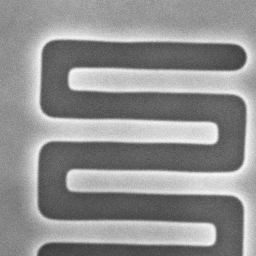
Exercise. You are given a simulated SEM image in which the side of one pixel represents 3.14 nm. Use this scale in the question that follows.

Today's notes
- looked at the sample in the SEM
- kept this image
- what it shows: groups of lines, slits or small figures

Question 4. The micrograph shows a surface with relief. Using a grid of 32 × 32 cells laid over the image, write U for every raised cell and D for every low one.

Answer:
UUUUUUUUUUUUUUUUUUUUUUUUUUUUUUUU
UUUUUUUUUUUUUUUUUUUUUUUUUUUUUUUU
UUUUUUUUUUUUUUUUUUUUUUUUUUUUUUUU
UUUUUUUUUUUUUUUUUUUUUUUUUUUUUUUU
UUUUUUUUUUUUUUUUUUUUUUUUUUUUUUUU
UUUUUUDDDDDDDDDDDDDDDDDDDDDDDDUU
UUUUUDDDDDDDDDDDDDDDDDDDDDDDDDDU
UUUUUDDDDDDDDDDDDDDDDDDDDDDDDDDU
UUUUUDDDDDDDDDDDDDDDDDDDDDDDDDUU
UUUUUDDDDUUUUUUUUUUUUUUUUUUUUUUU
UUUUUDDDDUUUUUUUUUUUUUUUUUUUUUUU
UUUUUDDDDDDDDDDDDDDDDDDDUUUUUUUU
UUUUUDDDDDDDDDDDDDDDDDDDDDDDDDUU
UUUUUDDDDDDDDDDDDDDDDDDDDDDDDDDU
UUUUUUDDDDDDDDDDDDDDDDDDDDDDDDDU
UUUUUUUUUUUUUUUUUUUUUUUUUUUDDDDU
UUUUUUUUUUUUUUUUUUUUUUUUUUUDDDDU
UUUUUUUUUUUUUUUUUUUUUUUUUUUDDDDU
UUUUUDDDDDDDDDDDDDDDDDDDDDDDDDDU
UUUUUDDDDDDDDDDDDDDDDDDDDDDDDDDU
UUUUUDDDDDDDDDDDDDDDDDDDDDDDDDUU
UUUUUDDDDUUUUUUUUUUUUUDDDDDDDUUU
UUUUUDDDUUUUUUUUUUUUUUUUUUUUUUUU
UUUUUDDDDUUUUUUUUUUUUUUUUUUUUUUU
UUUUUDDDDDDDDDDDDDDDDDDDDDDDDUUU
UUUUUDDDDDDDDDDDDDDDDDDDDDDDDDUU
UUUUUDDDDDDDDDDDDDDDDDDDDDDDDDDU
UUUUUUUDDDDDDDDDDDDDDDDDDDDDDDDU
UUUUUUUUUUUUUUUUUUUUUUUUUUUDDDDU
UUUUUUUUUUUUUUUUUUUUUUUUUUUDDDDU
UUUUUUDDDDDDDDDDDDDDDDUUUUDDDDDU
UUUUUDDDDDDDDDDDDDDDDDDDDDDDDDDU